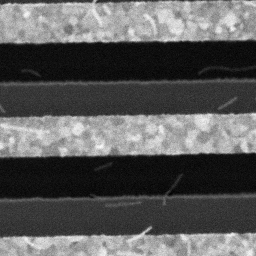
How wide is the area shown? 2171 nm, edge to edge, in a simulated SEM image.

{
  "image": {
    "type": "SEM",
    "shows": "lines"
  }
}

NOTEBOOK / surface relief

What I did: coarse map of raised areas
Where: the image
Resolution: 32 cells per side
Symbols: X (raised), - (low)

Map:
XXXXXXXXXXXXXXXXXXXXXXXXXXXXXXXX
XXXXXXXXXXXXXXXXXXXXXXXXXXXXXXXX
XXXXXXXXXXXXXXXXXXXXXXXXXXXXXXXX
XXXXXXXXXXXXXXXXXXXXXXXXXXXXXXXX
XXXXXXXXXXXXXXXXXXXXXXXXXXXXXXXX
--------------------------------
--------------------------------
--------------------------------
--------------------------------
--------------------------------
-X---XXXXXXXXXXXXXXXXXXXXXXXXXXX
XXXXXXXXXXXXXXXXXXXXXXXXXXXXXXXX
XXXXXXXXXXXXXXXXXXXXXXXXXXXXXXXX
XXXXXXXXXXXXXXXXXXXXXXXXXXXXXXXX
XXXXXXXXXXXXXXXXXXXXXXXXXXXXXXXX
XXXXXXXXXXXXXXXXXXXXXXXXXXXXXXXX
XXXXXXXXXXXXXXXXXXXXXXXXXXXXXXXX
XXXXXXXXXXXXXXXXXXXXXXXXXXXXXXXX
XXXXXXXXXXXXXXXXXXXXXXXXXXXXXXXX
XXXXXX-X------------------------
--------------------------------
--------------------------------
--------------------------------
--------------------------------
--------------------X------XXXXX
XXXXXXXXXXXXXXXXXXXXXXXXXXXXXXXX
XXXXXXXXXXXXXXXXXXXXXXXXXXXXXXXX
XXXXXXXXXXXXXXXXXXXXXXXXXXXXXXXX
XXXXXXXXXXXXXXXXXXXXXXXXXXXXXXXX
XXXXXXXXXXXXXXXXXXXXXXXXXXXXXXXX
XXXXXXXXXXXXXXXXXXXXXXXXXXXXXXXX
XXXXXXXXXXXXXXXXXXXXXXXXXXXXXXXX